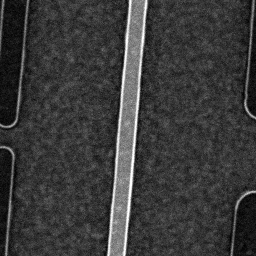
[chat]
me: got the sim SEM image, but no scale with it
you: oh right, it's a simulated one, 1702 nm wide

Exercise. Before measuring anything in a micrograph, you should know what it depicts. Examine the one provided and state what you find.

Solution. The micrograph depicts one or a few lines or trenches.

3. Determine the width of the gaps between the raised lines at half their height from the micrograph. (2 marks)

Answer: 0.684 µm